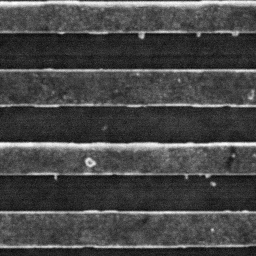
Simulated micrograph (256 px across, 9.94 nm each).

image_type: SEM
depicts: lines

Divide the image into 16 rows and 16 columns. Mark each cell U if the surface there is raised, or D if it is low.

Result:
UUUUUUUUUUUUUUUU
UUUUUUUUUUUUUUUU
DDDDDDDDDDDDDDDD
DDDDDDDDDDDDDDDD
UUUUUUUUUUUUUUUU
UUUUUUUUUUUUUUUU
UUUUUUUUUUUUUUUU
DDDDDDDDDDDDDDDD
DDDDDDDDDDDDDDDD
UUUUUUUUUUUUUUUU
UUUUUUUUUUUUUUUU
DDDDDDDDDDDDDDDD
DDDDDDDDDDDDDDDD
UUUUUUUUUUUUUUUU
UUUUUUUUUUUUUUUU
DDDDDDDDDDDDDDDD